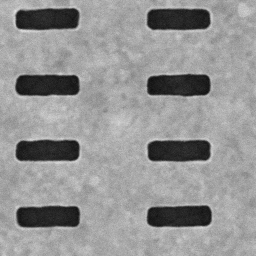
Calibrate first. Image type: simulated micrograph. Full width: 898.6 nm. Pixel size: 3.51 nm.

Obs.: a regular array of holes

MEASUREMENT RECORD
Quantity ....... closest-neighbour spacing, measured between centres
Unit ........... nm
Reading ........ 230